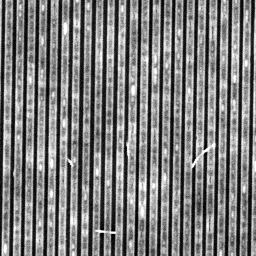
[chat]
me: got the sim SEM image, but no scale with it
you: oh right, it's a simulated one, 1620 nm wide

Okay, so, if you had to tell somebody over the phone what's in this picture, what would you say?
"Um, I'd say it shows parallel lines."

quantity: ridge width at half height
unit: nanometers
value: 41.9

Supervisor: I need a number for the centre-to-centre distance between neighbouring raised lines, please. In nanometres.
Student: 71.8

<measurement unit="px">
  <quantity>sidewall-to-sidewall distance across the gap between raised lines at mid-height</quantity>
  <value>4.76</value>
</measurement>